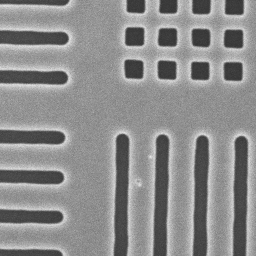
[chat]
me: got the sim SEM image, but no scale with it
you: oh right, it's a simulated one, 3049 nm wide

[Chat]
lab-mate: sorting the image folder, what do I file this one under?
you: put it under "groups of lines, slits or small figures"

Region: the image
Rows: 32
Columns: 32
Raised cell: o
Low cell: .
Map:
........oooooooo..oo..oo..oo...o
oooooooooooooooo..oo..oo..oo..oo
oooooooooooooooooooooooooooooooo
oooooooooooooooo..oo.ooooooooooo
.........ooooooo..oo..oo..oo..oo
........oooooooo..oo..oo..oo..oo
oooooooooooooooooooooooooooooooo
oooooooooooooooo.ooo.ooooooooooo
oooooooooooooooo..oo..oo..oo..oo
........oooooooo..oo..oo..oo..oo
........oooooooooooooooooooooooo
oooooooooooooooooooooooooooooooo
oooooooooooooooooooooooooooooooo
oooooooooooooooooooooooooooooooo
oooooooooooooooooooooooooooooooo
oooooooooooooooooooooooooooooooo
........oooooooooooooooooooooooo
........ooooooo.oooo.oooo.ooo..o
oooooooooooooo..ooo..ooo..ooo..o
oooooooooooooo..ooo..ooo..ooo..o
oooooooooooooo..ooo..ooo..ooo..o
........oooooo..ooo..ooo..ooo..o
........oooooo..ooo..ooo..ooo..o
oooooooooooooo..ooo..ooo..ooo..o
oooooooooooooo..ooo..ooo..ooo..o
oooooooooooooo..ooo..ooo..ooo..o
........oooooo..ooo..ooo..ooo..o
........oooooo..ooo..ooo..ooo..o
oooooooooooooo..ooo..ooo..ooo..o
oooooooooooooo..ooo..ooo..ooo..o
oooooooooooooo..ooo..ooo..ooo..o
........oooooo..ooo..ooo..ooo..o